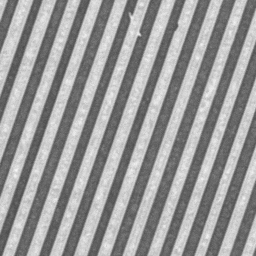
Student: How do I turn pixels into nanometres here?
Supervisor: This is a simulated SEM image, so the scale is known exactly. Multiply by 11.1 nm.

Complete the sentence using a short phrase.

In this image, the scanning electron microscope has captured parallel lines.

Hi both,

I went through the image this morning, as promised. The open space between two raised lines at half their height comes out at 131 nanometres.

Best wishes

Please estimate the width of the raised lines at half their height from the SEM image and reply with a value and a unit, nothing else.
122 nm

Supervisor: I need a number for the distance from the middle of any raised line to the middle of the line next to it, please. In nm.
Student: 250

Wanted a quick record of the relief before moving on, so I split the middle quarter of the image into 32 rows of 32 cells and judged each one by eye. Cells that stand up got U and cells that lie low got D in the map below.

DUUUDDDUUUDDDUUUDDDUUUDDDUUUDDDU
DUUDDDDUUUDDDUUDDDDUUUDDUUUUDDDU
UUUDDDUUUDDDUUUDDDUUUDDDUUUDDDUU
UUUDDDUUUDDDUUUDDDUUUDDDUUUDDDUU
UUDDDDUUUDDDUUDDDDUUUDDUUUUDDDUU
UUDDDUUUDDDUUUDDDUUUDDDUUUDDDUUU
UUDDDUUUDDDUUUDDDUUUDDDUUUDDDUUU
UDDDDUUUDDDUUDDDDUUUDDUUUUDDDUUU
UDDDUUUDDDUUUDDDUUUDDDUUUDDDUUUD
UDDDUUUDDDUUUDDDUUUDDDUUUDDDUUUD
DDDDUUUDDUUUDDDDUUUDDUUUDDDDUUUD
DDDUUUDDDUUUDDDUUUDDDUUUDDDUUUDD
DDDUUUDDDUUUDDDUUUDDDUUUDDDUUUDD
DDDUUUDDUUUDDDDUUUDDUUUDDDDUUDDD
DDUUUDDDUUUDDDUUUDDDUUUDDDUUUDDD
DDUUUDDDUUUDDDUUUDDDUUUDDDUUUDDD
DDUUUDDUUUDDDUUUUDDUUUDDDDUUDDDD
DUUUDDDUUUDDDUUUDDDUUUDDDUUUDDDU
DUUUDDDUUUDDDUUUDDDUUUDDDUUUDDDU
DUUDDDUUUDDDUUUUDDUUUDDDDUUDDDDU
UUUDDDUUUDDDUUUDDDUUUDDDUUUDDDUU
UUUDDDUUUDDDUUUDDDUUUDDDUUUDDDUU
UUDDDUUUDDDUUUUDDUUUDDDUUUDDDDUU
UUDDDUUUDDDUUUDDDUUUDDDUUUDDDUUU
UUDDDUUUDDDUUUDDDUUUDDDUUUDDDUUU
UDDDUUUDDDUUUDDDUUUDDDUUUDDDDUUD
UDDDUUUDDDUUUDDDUUUDDDUUUDDDUUUD
UDDDUUUDDDUUUDDUUUUDDDUUUDDDUUUD
DDDUUUDDDUUUDDDUUUDDDUUUDDDDUUDD
DDDUUUDDDUUUDDDUUUDDDUUUDDDUUUDD
DDDUUDDDDUUUDDUUUUDDDUUUDDDUUUDD
DDUUUDDDUUUDDDUUUDDDUUUDDDDUUDDD